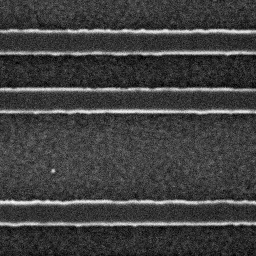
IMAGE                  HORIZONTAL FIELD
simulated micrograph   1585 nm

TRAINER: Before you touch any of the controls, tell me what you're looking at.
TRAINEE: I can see lines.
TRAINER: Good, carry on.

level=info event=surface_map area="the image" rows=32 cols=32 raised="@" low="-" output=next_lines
--------------------------------
--------------------------------
--------------------------------
--------------------------------
@@@@@@@@@@@@@@@@@@@@@@@@@@@@@@@@
@@@@@@@@@@@@@@@@@@@@@@@@@@@@@@@@
@@@@@@@@@@@@@@@@@@@@@@@@@@@@@@@@
--------------------------------
--------------------------------
--------------------------------
--------------------------------
@@@@@@@@@@@@@@@@@@@@@@@@@@@@@@@@
@@@@@@@@@@@@@@@@@@@@@@@@@@@@@@@@
@@@@@@@@@@@@@@@@@@@@@@@@@@@@@@@@
--------------------------------
--------------------------------
--------------------------------
--------------------------------
--------------------------------
--------------------------------
--------------------------------
--------------------------------
--------------------------------
--------------------------------
--------------------------------
@@@@@@@@@@@@@@@@@@@@@@@@@@@@@@@@
@@@@@@@@@@@@@@@@@@@@@@@@@@@@@@@@
@@@@@@@@@@@@@@@@@@@@@@@@@@@@@@@@
--------------------------------
--------------------------------
--------------------------------
--------------------------------